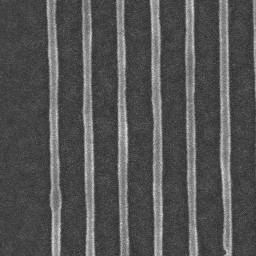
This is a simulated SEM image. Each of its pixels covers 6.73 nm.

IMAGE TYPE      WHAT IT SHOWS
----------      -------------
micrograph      parallel lines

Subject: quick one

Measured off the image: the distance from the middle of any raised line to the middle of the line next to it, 230 nm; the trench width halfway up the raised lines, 180 nm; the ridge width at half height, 0.0471 microns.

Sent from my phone